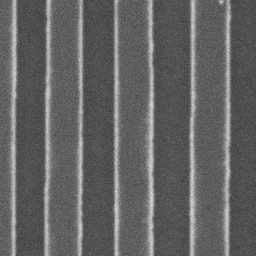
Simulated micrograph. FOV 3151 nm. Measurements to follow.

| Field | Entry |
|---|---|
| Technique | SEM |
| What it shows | lines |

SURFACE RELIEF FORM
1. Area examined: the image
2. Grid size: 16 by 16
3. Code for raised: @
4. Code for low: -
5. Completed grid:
@--@@--@@---@@--
@--@@--@@---@@--
@--@@--@@@--@@--
@--@@--@@@--@@--
@--@@--@@@--@@--
@--@@--@@@--@@--
@--@@--@@@--@@--
@--@@--@@@--@@--
@--@@--@@@--@@--
@--@@--@@---@@--
@--@@--@@---@@--
@--@@--@@@--@@--
@--@@--@@@--@@--
@--@@--@@---@@--
@--@@--@@@--@@--
@--@@--@@@--@@--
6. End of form